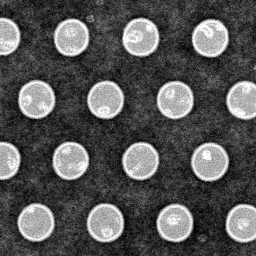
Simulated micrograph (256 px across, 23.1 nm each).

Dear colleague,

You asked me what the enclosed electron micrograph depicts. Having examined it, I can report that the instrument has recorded a regular array of raised bodies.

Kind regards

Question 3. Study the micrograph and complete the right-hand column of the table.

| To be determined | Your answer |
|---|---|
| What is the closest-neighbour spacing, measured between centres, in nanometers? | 1600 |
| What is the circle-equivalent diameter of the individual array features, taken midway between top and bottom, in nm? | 820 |